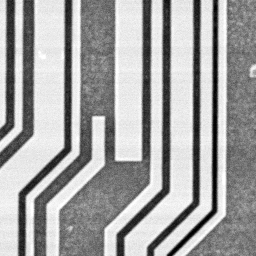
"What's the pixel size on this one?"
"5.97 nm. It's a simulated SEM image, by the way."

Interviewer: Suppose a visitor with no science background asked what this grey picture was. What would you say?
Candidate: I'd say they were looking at groups of lines, slits or small figures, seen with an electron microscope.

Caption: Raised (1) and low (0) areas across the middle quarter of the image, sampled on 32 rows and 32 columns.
00110000000001111110001100011111
00110000000001111110001100011111
00110000000001111110001100011111
00110000000001111110001100011111
00110000000001111110001100011111
00110000000001111110001100011111
00110000000001111110001100011111
00110000000001111110001100011111
00110000000001111110001100011111
00110000000001111110001100011111
00110000000001111110001100011111
00110000000001111110001100011111
00110000000001111110001100011111
00110001110001111110001100011111
00110001110001111110001100011111
00110001110001111110001100011111
00110001110001111110001100011111
00110001110001111110001100011111
00110001110001111110001100011111
00110001110001111110001100011111
00110001110001111110001100011111
00110001110001111110001100011111
01110001110001111110001100011111
11100001110001111110001100011111
11000001110000000000001100011111
10000011110000000000001100011111
00000111100000000000001100011111
00001111000000000000001100011111
00011110000000000000001100011111
00111100000000000000001100011111
01111000000000000000011100011111
11110000000000000000111100011111